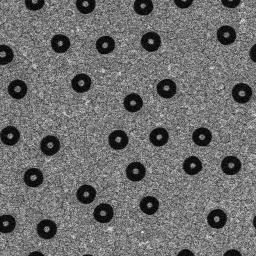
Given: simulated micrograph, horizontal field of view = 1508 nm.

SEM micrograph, a regular array of ring-shaped grooves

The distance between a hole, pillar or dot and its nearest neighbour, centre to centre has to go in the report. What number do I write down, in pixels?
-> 37.2